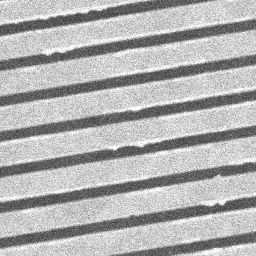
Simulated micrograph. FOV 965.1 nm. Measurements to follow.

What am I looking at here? parallel lines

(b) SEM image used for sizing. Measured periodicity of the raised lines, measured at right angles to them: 132 nanometres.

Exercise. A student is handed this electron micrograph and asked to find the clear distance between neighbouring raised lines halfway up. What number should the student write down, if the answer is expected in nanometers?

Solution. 45.7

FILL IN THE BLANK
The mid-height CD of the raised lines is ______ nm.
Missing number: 87.5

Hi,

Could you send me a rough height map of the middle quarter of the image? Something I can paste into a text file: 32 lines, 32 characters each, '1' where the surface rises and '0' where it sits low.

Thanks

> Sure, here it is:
11111111111111111111111111110000
11111111111111111111111000000000
11111111111111111000000000000000
11111111110000000000000000000011
11110000000000000000000011111111
00000000000000000011111111111111
00000000000011111111111111111111
00000111111111111111111111111111
11111111111111111111111111111111
11111111111111111111111111110000
11111111111111111111110000000000
11111111111111110110000000000000
11111111100000000000000000000111
11110000000000000000000111111111
00000000000000001111111111111111
00000000000111111111111111111111
00000111111111111111111111111111
11111111111111111111111111111111
11111111111111111111111111110000
11111111111111111111111000000000
11111111111111100011000000000000
11111111000000000000000000001111
11000000000000000000001111111111
00000000000000011111111111111111
00000000011111111111111111111111
00011111111111111111111111111111
11111111111111111111111111111111
11111111111111111111111111000000
11111111111111111111100000000000
11111111111111000000000000000000
11111111000000000000000000011111
11100000000000000000011111111111